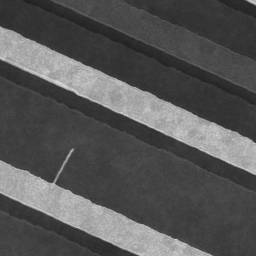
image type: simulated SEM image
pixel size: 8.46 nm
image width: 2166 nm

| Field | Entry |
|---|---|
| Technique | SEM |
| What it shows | lines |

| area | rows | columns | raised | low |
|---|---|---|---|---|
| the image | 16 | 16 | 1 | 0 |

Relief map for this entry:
0000111110000000
0000001111100000
1100000001111000
1111000000011110
0011110000000111
0000111100000001
0000001111100000
0000000011111000
0000000000011110
0000000000000111
1000000000000001
1110000000000000
0111100000000000
0001111100000000
0000011111000000
0000000011110000